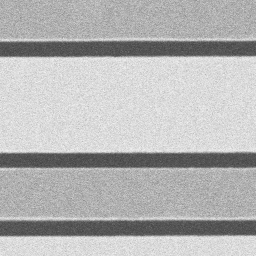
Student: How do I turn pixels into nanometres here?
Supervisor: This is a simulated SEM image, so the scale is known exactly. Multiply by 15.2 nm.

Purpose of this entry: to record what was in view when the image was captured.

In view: lines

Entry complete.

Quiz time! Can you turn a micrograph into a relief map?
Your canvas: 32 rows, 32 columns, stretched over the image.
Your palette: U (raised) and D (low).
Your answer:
UUUUUUUUUUUUUUUUUUUUUUUUUUUUUUUU
UUUUUUUUUUUUUUUUUUUUUUUUUUUUUUUU
UUUUUUUUUUUUUUUUUUUUUUUUUUUUUUUU
UUUUUUUUUUUUUUUUUUUUUUUUUUUUUUUU
UUUUUUUUUUUUUUUUUUUUUUUUUUUUUUUU
DDDDDDDDDDDDDDDDDDDDDDDDDDDDDDDD
DDDDDDDDDDDDDDDDDDDDDDDDDDDDDDDD
UUUUUUUUUUUUUUUUUUUUUUUUUUUUUUUU
UUUUUUUUUUUUUUUUUUUUUUUUUUUUUUUU
UUUUUUUUUUUUUUUUUUUUUUUUUUUUUUUU
UUUUUUUUUUUUUUUUUUUUUUUUUUUUUUUU
UUUUUUUUUUUUUUUUUUUUUUUUUUUUUUUU
UUUUUUUUUUUUUUUUUUUUUUUUUUUUUUUU
UUUUUUUUUUUUUUUUUUUUUUUUUUUUUUUU
UUUUUUUUUUUUUUUUUUUUUUUUUUUUUUUU
UUUUUUUUUUUUUUUUUUUUUUUUUUUUUUUU
UUUUUUUUUUUUUUUUUUUUUUUUUUUUUUUU
UUUUUUUUUUUUUUUUUUUUUUUUUUUUUUUU
UUUUUUUUUUUUUUUUUUUUUUUUUUUUUUUU
DDDDDDDDDDDDDDDDDDDDDDDDDDDDDDDD
DDDDDDDDDDDDDDDDDDDDDDDDDDDDDDDD
UUUUUUUUUUUUUUUUUUUUUUUUUUUUUUUU
UUUUUUUUUUUUUUUUUUUUUUUUUUUUUUUU
UUUUUUUUUUUUUUUUUUUUUUUUUUUUUUUU
UUUUUUUUUUUUUUUUUUUUUUUUUUUUUUUU
UUUUUUUUUUUUUUUUUUUUUUUUUUUUUUUU
UUUUUUUUUUUUUUUUUUUUUUUUUUUUUUUU
DDDDDDDDDDDDDDDDDDDDDDDDDDDDDDDD
DDDDDDDDDDDDDDDDDDDDDDDDDDDDDDDD
DDDDDDDDDDDDDDDDDDDUUUUUUUUUUUUU
UUUUUUUUUUUUUUUUUUUUUUUUUUUUUUUU
UUUUUUUUUUUUUUUUUUUUUUUUUUUUUUUU